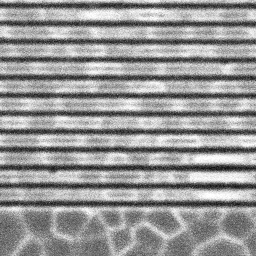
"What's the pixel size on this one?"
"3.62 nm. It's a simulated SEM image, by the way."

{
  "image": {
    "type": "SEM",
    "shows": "parallel lines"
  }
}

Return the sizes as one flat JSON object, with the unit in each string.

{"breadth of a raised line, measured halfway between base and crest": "38 nanometers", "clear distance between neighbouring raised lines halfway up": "25.8 nm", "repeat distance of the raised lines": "0.0652 micrometres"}